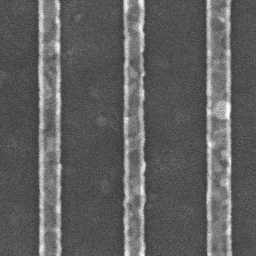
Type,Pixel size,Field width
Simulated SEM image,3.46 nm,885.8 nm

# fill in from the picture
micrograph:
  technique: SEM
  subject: one or a few lines or trenches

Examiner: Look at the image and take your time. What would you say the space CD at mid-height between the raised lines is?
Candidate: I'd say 0.232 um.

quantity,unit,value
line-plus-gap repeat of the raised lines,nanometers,292